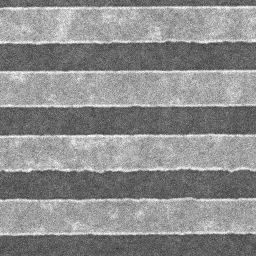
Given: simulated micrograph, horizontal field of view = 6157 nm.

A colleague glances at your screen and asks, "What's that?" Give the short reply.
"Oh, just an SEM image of one or a few lines or trenches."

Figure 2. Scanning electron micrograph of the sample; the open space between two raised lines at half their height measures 718 nanometers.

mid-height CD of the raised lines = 0.821 microns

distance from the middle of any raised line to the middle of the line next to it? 1.54 µm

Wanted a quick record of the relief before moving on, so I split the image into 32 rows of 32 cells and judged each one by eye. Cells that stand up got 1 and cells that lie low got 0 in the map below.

00000000000000000000000000000000
11111111111111111111111111111111
11111111111111111111111111111111
11111111111111111111111111111111
11111111111111111111111111111111
00000000000000000000000000000000
00000000000000000000000000000000
00000000000000000000000000000000
00000000000000000000000000000000
11111111111111111111111111111111
11111111111111111111111111111111
11111111111111111111111111111111
11111111111111111111111111111111
00000000000000000000000000000000
00000000000000000000000000000000
00000000000000000000000000000000
00000000000000000000000000000000
11111111111111111111111111111111
11111111111111111111111111111111
11111111111111111111111111111111
11111111111111111111111111111111
00000000000000000000000000000000
00000000000000000000000000000000
00000000000000000000000000000000
00000000000000000000000000000000
11111111111111111111111111111111
11111111111111111111111111111111
11111111111111111111111111111111
11111111111111111111111111111111
00000000000000000000000000000000
00000000000000000000000000000000
00000000000000000000000000000000